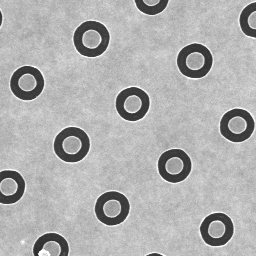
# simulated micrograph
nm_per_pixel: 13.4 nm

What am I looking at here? a regular array of ring-shaped grooves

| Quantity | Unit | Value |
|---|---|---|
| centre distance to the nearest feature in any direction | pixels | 75.4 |